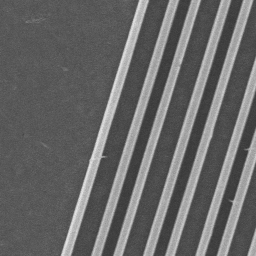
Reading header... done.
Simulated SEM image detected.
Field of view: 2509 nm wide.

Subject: parallel lines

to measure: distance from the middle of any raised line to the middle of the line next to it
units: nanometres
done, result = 245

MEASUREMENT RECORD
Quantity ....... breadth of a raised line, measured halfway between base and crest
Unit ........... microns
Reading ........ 0.0843